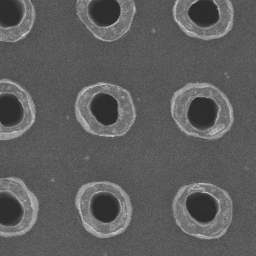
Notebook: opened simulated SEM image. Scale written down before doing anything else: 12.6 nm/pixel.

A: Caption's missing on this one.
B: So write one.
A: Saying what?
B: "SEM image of ring-shaped raised bodies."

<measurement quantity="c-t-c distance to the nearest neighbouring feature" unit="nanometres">1230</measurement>